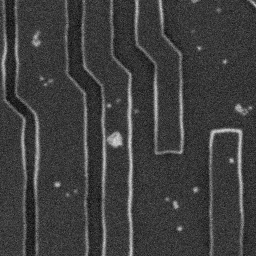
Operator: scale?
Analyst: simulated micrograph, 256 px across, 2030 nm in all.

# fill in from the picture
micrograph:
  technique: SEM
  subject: groups of lines, slits or small figures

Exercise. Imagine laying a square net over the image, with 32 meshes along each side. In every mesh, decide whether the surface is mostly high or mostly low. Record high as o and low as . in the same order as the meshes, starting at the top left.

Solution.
..oooooo..oooo...ooo............
..oooooo..oooo...ooo............
o.oooooo..oooo...ooo............
o.oooooo..oooo...ooo............
o.oooooo..oooo...oooo...........
o.oooooo..oooo...oooo...........
o.oooooo..oooo....oooo..........
..oooooo..ooooo....oooo.........
..oooooo...ooooo....ooo.........
..ooooooo...oooo...oooo.........
..oooooooo..oooo...oooo.........
o.oooooooo...ooo....ooo.........
o..oooooooo..ooo....ooo.........
oo..ooooooo..ooo....ooo.........
ooo.ooooooo..ooo....ooo.........
ooo..oooooo..ooo....ooo.........
ooo..oooooo..ooo....ooo....ooo..
ooo..oooooo..ooo....ooo...oooo..
ooo..oooooo..ooo....ooo...oooo..
ooo..oooooo..ooo..........oooo..
ooo..oooooo..ooo..........oooo..
ooo..oooooo..ooo..........oooo..
ooo.ooooooo..ooo..........oooo..
ooo.ooooooo..ooo..........oooo..
ooo..oooooo..ooo..........oooo..
ooo..oooooo..ooo..........oooo..
ooo..oooooo..ooo..........oooo..
ooo..oooooo..ooo..........oooo..
ooo..oooooo..ooo..........oooo..
ooo..oooooo..ooo..........oooo..
ooo..oooooo..ooo..........oooo..
ooo..oooooo..ooo..........oooo..